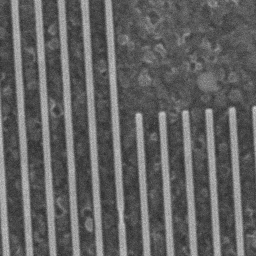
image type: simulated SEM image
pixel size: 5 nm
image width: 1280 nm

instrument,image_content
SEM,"parallel lines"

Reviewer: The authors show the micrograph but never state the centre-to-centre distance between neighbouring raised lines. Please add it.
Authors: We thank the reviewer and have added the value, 0.117 microns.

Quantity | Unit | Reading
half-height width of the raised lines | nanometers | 29.3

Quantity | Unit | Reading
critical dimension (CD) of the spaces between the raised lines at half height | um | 0.0867